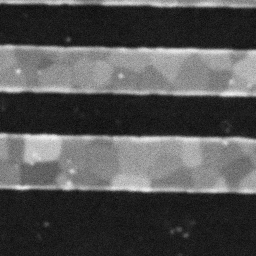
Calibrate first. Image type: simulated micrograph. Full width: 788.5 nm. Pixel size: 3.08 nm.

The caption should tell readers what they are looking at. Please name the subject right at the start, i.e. wiring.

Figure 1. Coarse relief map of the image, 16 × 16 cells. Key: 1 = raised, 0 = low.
0000000000000000
0000000000000000
0000000000000000
1111100111111111
1111111111111111
1111111111111111
0000000000000000
0000000000000000
1111000000000000
1111111111111111
1011111011111111
0011110110111111
0000000000000000
0000000000000000
0000000000000000
0000000000000000